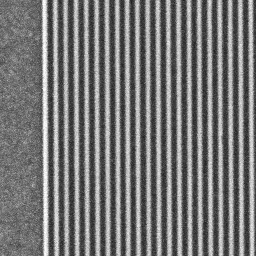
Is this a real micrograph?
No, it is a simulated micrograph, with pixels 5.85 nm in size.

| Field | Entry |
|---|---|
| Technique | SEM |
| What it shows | parallel lines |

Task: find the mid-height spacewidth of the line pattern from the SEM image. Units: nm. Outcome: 40.2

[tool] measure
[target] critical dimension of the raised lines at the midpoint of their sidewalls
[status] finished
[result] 22.7 nm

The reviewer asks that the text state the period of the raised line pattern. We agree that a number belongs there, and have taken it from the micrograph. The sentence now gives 60.2 nanometres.